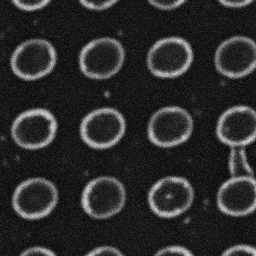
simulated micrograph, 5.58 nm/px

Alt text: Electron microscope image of a regular array of raised bodies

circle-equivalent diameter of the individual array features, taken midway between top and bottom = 228 nm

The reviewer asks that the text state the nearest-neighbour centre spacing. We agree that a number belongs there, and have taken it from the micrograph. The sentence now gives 68.1 pixels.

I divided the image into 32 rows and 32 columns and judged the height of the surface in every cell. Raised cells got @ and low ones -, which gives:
--@@@@----@@@@-----@@@------@@@-
--------------------------------
--------------------------------
--------------------------------
--------------------------------
---@@@-----@@@@-----@@@-----@@@@
--@@@@@---@@@@@----@@@@@---@@@@@
--@@@@@---@@@@@----@@@@@---@@@@@
--@@@@----@@@@@----@@@@----@@@@@
---@@------@@@-------@-------@--
--------------------------------
--------------------------------
--------------------------------
-----------------------------@@-
--@@@@-----@@@@----@@@@@----@@@@
--@@@@@---@@@@@@---@@@@@---@@@@@
--@@@@@---@@@@@----@@@@@---@@@@@
--@@@@-----@@@@----@@@@-----@@@@
----@------------------------@@-
-----------------------------@@-
-----------------------------@@-
-----------------------------@@@
----@-------@@------@@@------@@@
--@@@@@----@@@@----@@@@@----@@@@
--@@@@@---@@@@@@---@@@@@---@@@@@
--@@@@@---@@@@@----@@@@@---@@@@@
--@@@@-----@@@-----@@@@-----@@@-
--------------------------------
--------------------------------
--------------------------------
--------------------------------
---@@@------@@@-----@@@@----@@@@